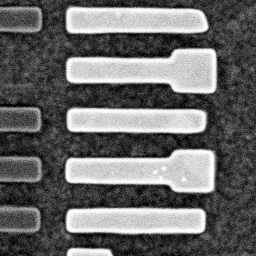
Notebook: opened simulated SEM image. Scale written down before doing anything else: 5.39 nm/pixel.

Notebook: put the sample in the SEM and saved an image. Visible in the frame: wiring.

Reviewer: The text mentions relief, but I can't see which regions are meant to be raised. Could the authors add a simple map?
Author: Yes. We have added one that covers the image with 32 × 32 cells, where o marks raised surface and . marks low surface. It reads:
................................
ooooo....oooooooooooooooo.......
ooooo...oooooooooooooooooo......
ooooo...oooooooooooooooooo......
................................
................................
......................ooooo.....
.........oooooooooooooooooo.....
........ooooooooooooooooooo.....
........ooooooooooooooooooo.....
.....................oooooo.....
.......................ooo......
................................
oooo............................
ooooo....ooooooooooooooooo......
ooooo....ooooooooooooooooo......
................................
................................
................................
.....................oooooo.....
ooooo...ooooooooooooooooooo.....
ooooo...ooooooooooooooooooo.....
ooooo....oooooooooooooooooo.....
......................ooooo.....
................................
................................
ooooo....oooooooooooooooo.......
ooooo...oooooooooooooooooo......
ooooo...oooooooooooooooooo......
................................
................................
.........ooooo..................